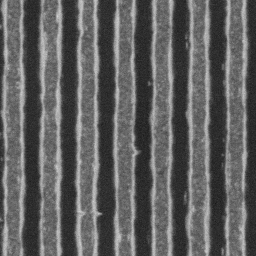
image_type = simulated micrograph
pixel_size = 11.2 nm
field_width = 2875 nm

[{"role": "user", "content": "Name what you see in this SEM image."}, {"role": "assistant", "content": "parallel lines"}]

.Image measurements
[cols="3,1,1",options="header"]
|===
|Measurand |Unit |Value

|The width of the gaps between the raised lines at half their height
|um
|0.222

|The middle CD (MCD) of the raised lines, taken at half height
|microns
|0.192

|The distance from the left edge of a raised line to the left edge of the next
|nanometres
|416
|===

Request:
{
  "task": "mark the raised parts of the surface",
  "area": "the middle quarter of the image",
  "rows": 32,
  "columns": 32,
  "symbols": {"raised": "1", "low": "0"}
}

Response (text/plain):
00001111000001111000000111000000
00001111000001111000001111000000
00001111000001111000000111000000
00001111000001111000000111100000
00001111000001111100000111100000
00001111000001111100000111100000
00001111000001111100000111100000
00001111000001111100000111100000
00001111000001111100000111100000
00001111000001111100000111100000
00001111000001111100001111100000
00001111000001111000001111100000
00001111000001111000001111000000
00001111000001111100000111000000
00001111000001111100001111000000
00001111000001111000001111000000
00001111000001111000001111000000
00001111000001111000001111100000
00001111000001111000001111100000
00001111000001111000001111100000
00001111000001111000001111100000
00001111000001111100001111000000
00001111000001111100001111000000
00001111000001111000001111100000
00001111000001111000001111100000
00001111000001111000001111000000
00001111000001111000000111000000
00001111000001111000000111000000
00011111000001111000000111000000
00011111000001111000000111000001
00011111000001111000000111000000
00011111000001111000001111000000